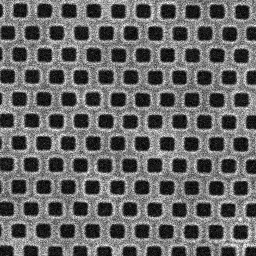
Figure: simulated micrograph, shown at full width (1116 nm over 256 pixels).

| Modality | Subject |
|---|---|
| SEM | a regular array of holes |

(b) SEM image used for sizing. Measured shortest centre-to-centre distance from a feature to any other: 0.106 um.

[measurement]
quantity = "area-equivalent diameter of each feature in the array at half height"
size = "71.5 nanometers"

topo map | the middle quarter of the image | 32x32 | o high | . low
oooooooooooooooooooooooooooooooo
ooo..oooo..ooooo..oooo..oooo..oo
oo....oo.....oo....oo....oo....o
oo....oo.....oo....oo....oo....o
ooo...ooo...ooo...ooo....oo....o
oooooooooooooooooooooooooooooooo
oooooooooooooooooooooooooooooooo
...oo....ooo...ooo...ooo....oo..
...oo....oo.....oo....oo....oo..
...oo....oo.....oo....oo....oo..
..oooo...ooo...ooo...ooo...ooo..
oooooooooooooooooooooooooooooooo
ooo...ooo...oooooooooooooooo..oo
oo....oo.....oo....oo....oo....o
oo....oo.....oo....oo....oo....o
oo....ooo...ooo...ooo....oo....o
oooooooooooooooooooooooooooooooo
oooooooooooooooooooooooooooooooo
...ooo...ooo...ooo...ooo....oo..
...oo....oo....oo....ooo....oo..
...oo....oo....oo....ooo....oo..
...ooo...ooo...ooo...ooo....oo..
oooooooooooooooooooooooooooooooo
ooo..oooo..oooo..ooooooooooooooo
oo....oo....ooo....oo....oo....o
oo....oo....oo.....oo....oo....o
oo....oo....oo....ooo....oo....o
oooooooooooooooooooooooooooooooo
oooooooooooooooooooooooooooooooo
...oo....ooo...ooo...ooo...ooo..
...oo....oo....ooo....oo....oo..
...oo....oo....ooo....oo....oo..